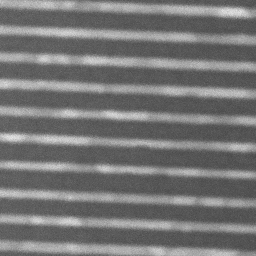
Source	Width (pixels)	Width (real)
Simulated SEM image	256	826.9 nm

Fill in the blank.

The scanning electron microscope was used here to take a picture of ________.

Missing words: parallel lines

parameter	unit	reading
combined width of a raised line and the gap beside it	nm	87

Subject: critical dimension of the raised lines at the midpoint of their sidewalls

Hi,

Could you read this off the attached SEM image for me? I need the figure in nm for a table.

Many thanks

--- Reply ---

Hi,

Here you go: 19.8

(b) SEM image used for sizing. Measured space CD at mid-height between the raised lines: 20.9 px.